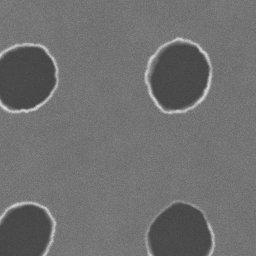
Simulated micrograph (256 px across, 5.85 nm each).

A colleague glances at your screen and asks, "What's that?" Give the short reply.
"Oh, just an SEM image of holes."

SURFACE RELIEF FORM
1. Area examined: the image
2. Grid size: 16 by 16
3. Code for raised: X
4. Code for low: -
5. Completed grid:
XXXXXXXXXXXXXXXX
XXXXXXXXXXXXXXXX
XXXXXXXXXXXXXXXX
---XXXXXXX---XXX
---XXXXXX----XXX
---XXXXXX----XXX
--XXXXXXXX--XXXX
XXXXXXXXXXXXXXXX
XXXXXXXXXXXXXXXX
XXXXXXXXXXXXXXXX
XXXXXXXXXXXXXXXX
XXXXXXXXXXXXXXXX
XXXXXXXXXXXXXXXX
---XXXXXXX---XXX
---XXXXXX----XXX
---XXXXXX----XXX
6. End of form